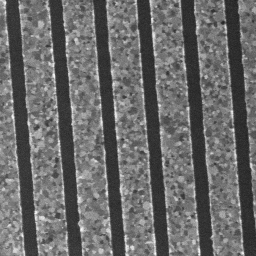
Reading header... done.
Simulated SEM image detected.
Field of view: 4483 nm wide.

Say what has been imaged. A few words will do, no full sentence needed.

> parallel lines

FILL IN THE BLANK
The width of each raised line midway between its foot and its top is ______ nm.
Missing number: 511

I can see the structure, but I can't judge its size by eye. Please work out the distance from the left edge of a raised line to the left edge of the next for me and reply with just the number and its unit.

765 nanometres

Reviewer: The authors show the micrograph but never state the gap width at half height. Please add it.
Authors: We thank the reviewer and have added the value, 255 nm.